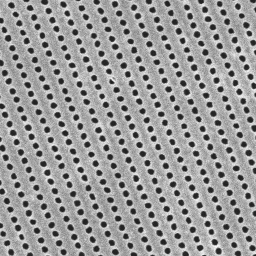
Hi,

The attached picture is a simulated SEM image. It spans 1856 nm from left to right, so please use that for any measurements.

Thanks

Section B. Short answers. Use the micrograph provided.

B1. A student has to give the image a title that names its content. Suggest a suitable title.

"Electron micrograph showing a regular array of holes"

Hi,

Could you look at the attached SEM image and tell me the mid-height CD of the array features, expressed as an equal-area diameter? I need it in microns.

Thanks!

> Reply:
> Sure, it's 0.0477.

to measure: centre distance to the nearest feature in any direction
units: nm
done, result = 69.9